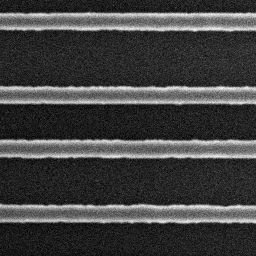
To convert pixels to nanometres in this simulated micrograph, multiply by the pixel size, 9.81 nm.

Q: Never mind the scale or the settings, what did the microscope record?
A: lines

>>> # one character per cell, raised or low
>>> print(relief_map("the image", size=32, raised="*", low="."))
................................
................................
********************************
********************************
................................
................................
................................
................................
................................
................................
................................
********************************
********************************
................................
................................
................................
................................
................................
********************************
********************************
................................
................................
................................
................................
................................
................................
********************************
********************************
................................
................................
................................
................................